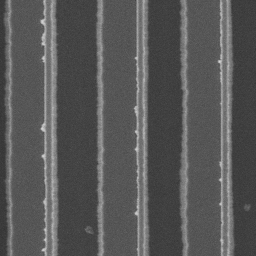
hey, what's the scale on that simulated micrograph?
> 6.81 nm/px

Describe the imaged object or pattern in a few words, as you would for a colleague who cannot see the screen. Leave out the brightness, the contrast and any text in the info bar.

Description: lines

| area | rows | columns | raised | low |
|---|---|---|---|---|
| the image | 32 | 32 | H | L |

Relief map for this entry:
LHHHHHHLLLLLLHHHHHLLLLLHHHHHLLLL
LHHHHHHLLLLLLHHHHHLLLLLHHHHHHLLL
LHHHHHHLLLLLLHHHHHLLLLLHHHHHHLLL
LHHHHHHLLLLLLHHHHHLLLLLHHHHHHLLL
LHHHHHHLLLLLLHHHHHLLLLLHHHHHHLLL
LHHHHHHLLLLLLHHHHHLLLLLHHHHHHLLL
LHHHHHHLLLLLLHHHHHLLLLLHHHHHHLLL
LHHHHHHLLLLLLHHHHHLLLLLHHHHHHLLL
LHHHHHHLLLLLLHHHHHLLLLLHHHHHHLLL
LHHHHHHLLLLLLHHHHHLLLLLHHHHHHLLL
LHHHHHHLLLLLLHHHHHLLLLLHHHHHHLLL
LHHHHHHLLLLLLHHHHHLLLLLHHHHHHLLL
LHHHHHHLLLLLLHHHHHLLLLLHHHHHHLLL
LHHHHHHLLLLLLHHHHHLLLLLHHHHHHLLL
LHHHHHHLLLLLLHHHHHLLLLLHHHHHHLLL
LHHHHHHLLLLLLHHHHHLLLLLHHHHHHLLL
LHHHHHHLLLLLLHHHHHLLLLLHHHHHHLLL
LHHHHHHLLLLLLHHHHHLLLLLHHHHHHLLL
LHHHHHHLLLLLLHHHHHLLLLLHHHHHHLLL
LHHHHHHLLLLLLHHHHHLLLLLHHHHHHLLL
LHHHHHHLLLLLLHHHHHLLLLLHHHHHHLLL
LHHHHHHLLLLLLHHHHHLLLLLHHHHHHLLL
LHHHHHHLLLLLLHHHHHLLLLLHHHHHHLLL
LHHHHHHLLLLLLHHHHHLLLLLHHHHHHLLL
LHHHHHHLLLLLLHHHHHLLLLLHHHHHHLLL
LHHHHHHLLLLLLHHHHHLLLLLHHHHHHLLL
LHHHHHHLLLLLLHHHHHLLLLLHHHHHHLLL
LHHHHHHLLLLLLHHHHHLLLLLHHHHHHLLL
LHHHHHHLLLLLLHHHHHLLLLLHHHHHHLLL
LHHHHHHLLLLLLHHHHHLLLLLHHHHHHLLL
LHHHHHHLLLLLLHHHHHLLLLLHHHHHHLLL
LHHHHHHLLLLLLHHHHHLLLLLHHHHHHLLL